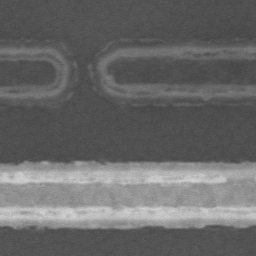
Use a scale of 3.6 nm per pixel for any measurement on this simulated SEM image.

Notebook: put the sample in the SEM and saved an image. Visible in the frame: one or a few lines or trenches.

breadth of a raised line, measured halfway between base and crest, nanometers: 152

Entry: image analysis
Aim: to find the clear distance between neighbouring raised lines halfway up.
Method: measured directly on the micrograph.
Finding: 80.2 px